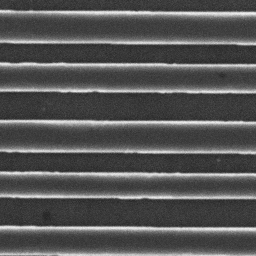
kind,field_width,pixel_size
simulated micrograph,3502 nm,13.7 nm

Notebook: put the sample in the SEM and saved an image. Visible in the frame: lines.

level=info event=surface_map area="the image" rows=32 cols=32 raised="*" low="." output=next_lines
................................
***********.....................
********************************
********************************
********************************
..............................**
................................
................................
********************************
********************************
********************************
........................********
................................
................................
................................
********************************
********************************
********************************
********************************
................................
................................
................................
********************************
********************************
********************************
................................
................................
................................
************....................
********************************
********************************
********************************